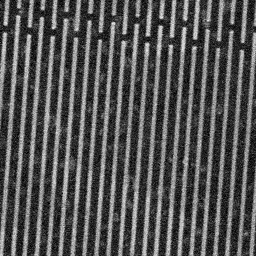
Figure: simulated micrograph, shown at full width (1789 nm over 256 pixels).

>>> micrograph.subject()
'parallel lines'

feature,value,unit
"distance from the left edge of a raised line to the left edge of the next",83.1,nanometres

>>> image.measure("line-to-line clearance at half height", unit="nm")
68.9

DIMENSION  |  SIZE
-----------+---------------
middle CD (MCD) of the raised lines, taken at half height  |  15.7 nm